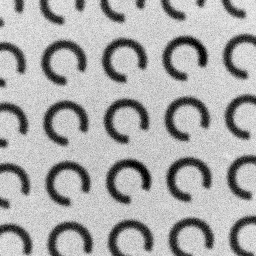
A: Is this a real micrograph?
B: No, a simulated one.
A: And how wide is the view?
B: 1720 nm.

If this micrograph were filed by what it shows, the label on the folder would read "an array of small figures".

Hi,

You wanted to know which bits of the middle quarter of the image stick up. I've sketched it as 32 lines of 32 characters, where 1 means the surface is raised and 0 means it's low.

11100011110011111100011110011111
11100111110001111111111110001111
11111111111000011111111111000001
11111111111000001111111111100001
01111111111110001111111111111111
11111111111111111111111111111111
11111111111111111111111111111111
11111111111111111111111111111111
11111111111111101111111111111000
00011111111100000001111111100000
00001111111000000000111111000011
00000111111000111100011111001111
11100011110001111110011110001111
11110011110011111110011110001111
11110011110011111110011110001111
11110011110001111110011110001111
11110011110001111111011111000111
11111111111000111111111111000001
01111111111100001111111111100001
01111111111110001111111111111101
01111111111111111111111111111111
11111111111111111111111111111111
11111111111111111111111111111111
11111111111111111111111111111000
00011111111110000001111111110000
00000111111100000000111111100000
00000011111000011100011111000111
11100011111001111110001111001111
11110001110001111110001110001111
11110001110001111110001111001111
11110001111001111110001111001111
11110011111001111111011111000111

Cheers